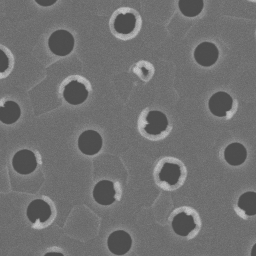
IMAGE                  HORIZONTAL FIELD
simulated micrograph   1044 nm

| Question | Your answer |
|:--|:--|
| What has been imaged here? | a regular array of holes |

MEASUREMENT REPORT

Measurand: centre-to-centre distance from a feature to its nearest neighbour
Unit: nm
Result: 212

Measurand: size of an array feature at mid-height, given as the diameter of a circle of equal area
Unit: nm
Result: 96.5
